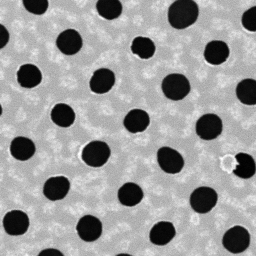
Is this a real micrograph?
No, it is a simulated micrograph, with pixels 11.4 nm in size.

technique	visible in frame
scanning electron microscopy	a regular array of holes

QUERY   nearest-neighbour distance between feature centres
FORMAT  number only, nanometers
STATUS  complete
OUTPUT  586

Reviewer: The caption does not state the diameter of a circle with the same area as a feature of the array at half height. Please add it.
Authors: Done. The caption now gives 25.9 px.